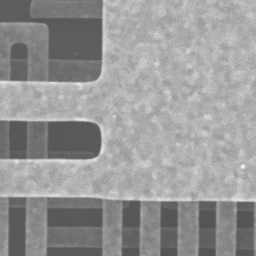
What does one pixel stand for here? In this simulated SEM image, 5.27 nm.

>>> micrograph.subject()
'wiring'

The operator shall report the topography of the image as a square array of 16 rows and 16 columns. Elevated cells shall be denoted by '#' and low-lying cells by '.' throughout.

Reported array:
......##########
......##########
......##########
......##########
......##########
################
################
################
......##########
......##########
################
################
.......#########
................
................
................